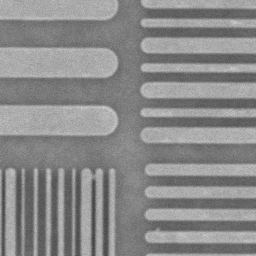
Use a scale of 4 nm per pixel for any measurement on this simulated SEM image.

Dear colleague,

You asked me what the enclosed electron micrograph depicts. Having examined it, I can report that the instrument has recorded groups of lines, slits or small figures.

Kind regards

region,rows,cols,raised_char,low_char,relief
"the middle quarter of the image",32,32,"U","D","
UUUUUUUUUUUUUDDDDDDUUUUUUUUUUUUU
UUUUUUUUUUUUUDDDDDDDUUUUUUUUUUUU
UUUUUUUUUUUUDDDDDDDDDDDDDDDDDDDD
DDDDDDDDDDDDDDDDDDDDDDDDDDDDDDDD
DDDDDDDDDDDDDDDDDDDDDDDDDDDDDDDD
DDDDDDDDDDDDDDDDDDDDUUUUUUUUUUUU
DDDDDDDDDDDDDDDDDDDUUUUUUUUUUUUU
DDDDDDDDDDDDDDDDDDDDUUUUUUUUUUUU
DDDDDDDDDDDDDDDDDDDDDDDDDDDDDDDD
DDDDDDDDDDDDDDDDDDDDDDDDDDDDDDDD
DDDDDDDDDDDDDDDDDDDDDDDDDDDDDDDD
UUUUUUUUUUUUDDDDDDDDUUUUUUUUUUUU
UUUUUUUUUUUUUDDDDDDUUUUUUUUUUUUU
UUUUUUUUUUUUUDDDDDDDDDDDDDDDDDDD
UUUUUUUUUUUUUDDDDDDDDDDDDDDDDDDD
UUUUUUUUUUUUUDDDDDDDDDDDDDDDDDDD
UUUUUUUUUUUUDDDDDDDDUUUUUUUUUUUU
UUUUUUUUUUUDDDDDDDDUUUUUUUUUUUUU
DDDDDDDDDDDDDDDDDDDUUUUUUUUUUUUU
DDDDDDDDDDDDDDDDDDDDUUUUUUUUUUUU
DDDDDDDDDDDDDDDDDDDDDDDDDDDDDDDD
DDDDDDDDDDDDDDDDDDDDDDDDDDDDDDDD
DDDDDDDDDDDDDDDDDDDDDDDDDDDDDDDD
DDDDDDDDDDDDDDDDDDDDDDDDDDDDDDDD
DDDDDDDDDDDDDDDDDDDDDDDDDDDDDDDD
DDDDDDDDDDDDDDDDDDDDDUUUUUUUUUUU
DDDDDUDDUDDDDDDDDDDDUUUUUUUUUUUU
DDDDUUUDUUDDUDDDDDDDDUUUUUUUUUUU
DDDDUUUDUUDDUDDDDDDDDDDDDDDDDDDD
DDDDUUUDUUDDUDDDDDDDDDDDDDDDDDDD
DDDDUUUDUUDDUDDDDDDDDDDDDDDDDDDD
DDDDUUUDUUDDUDDDDDDDUUUUUUUUUUUU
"